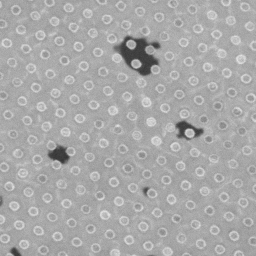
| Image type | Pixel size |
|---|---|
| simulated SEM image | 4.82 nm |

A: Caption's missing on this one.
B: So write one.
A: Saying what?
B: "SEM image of a regular array of raised bodies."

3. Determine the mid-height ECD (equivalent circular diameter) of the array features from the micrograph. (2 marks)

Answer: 42.5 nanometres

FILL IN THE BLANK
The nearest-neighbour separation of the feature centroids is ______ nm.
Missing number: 94